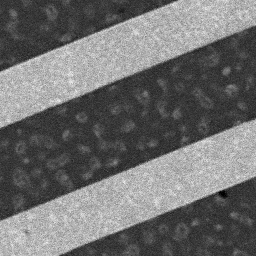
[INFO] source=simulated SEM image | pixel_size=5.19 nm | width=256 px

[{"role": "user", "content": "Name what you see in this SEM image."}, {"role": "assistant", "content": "one or a few lines or trenches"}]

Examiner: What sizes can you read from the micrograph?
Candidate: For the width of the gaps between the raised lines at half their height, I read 0.458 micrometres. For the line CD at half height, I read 268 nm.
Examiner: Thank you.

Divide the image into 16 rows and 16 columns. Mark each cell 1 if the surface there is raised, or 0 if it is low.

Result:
0000000000111111
0000000011111111
0000011111111100
0001111111100000
1111111110000000
1111110000000000
1111000000000000
1000000000000000
0000000000000111
0000000000011111
0000000011111111
0000001111111110
0001111111110000
0111111111000000
1111111000000000
1111100000000000